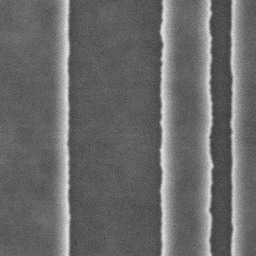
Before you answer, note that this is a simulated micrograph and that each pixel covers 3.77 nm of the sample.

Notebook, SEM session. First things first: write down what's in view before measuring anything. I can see lines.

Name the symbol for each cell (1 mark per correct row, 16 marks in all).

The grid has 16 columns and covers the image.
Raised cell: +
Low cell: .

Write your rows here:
++++......+++..+
++++......+++..+
++++......+++.++
++++......+++.++
++++......+++..+
++++......+++..+
++++......+++..+
++++......+++.++
++++......+++..+
++++......+++..+
++++......+++..+
++++......+++..+
++++......+++..+
++++......+++..+
++++......+++..+
++++......+++..+